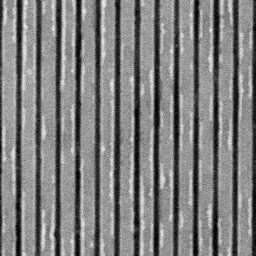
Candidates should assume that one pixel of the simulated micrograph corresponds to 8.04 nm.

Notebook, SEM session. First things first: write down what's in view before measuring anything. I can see parallel lines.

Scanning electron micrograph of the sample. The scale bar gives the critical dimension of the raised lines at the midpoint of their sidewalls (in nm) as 102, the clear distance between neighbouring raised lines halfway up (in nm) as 55.3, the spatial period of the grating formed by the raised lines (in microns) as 0.158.